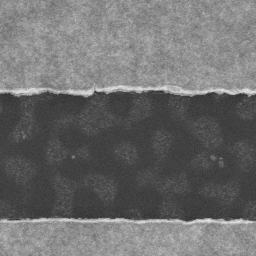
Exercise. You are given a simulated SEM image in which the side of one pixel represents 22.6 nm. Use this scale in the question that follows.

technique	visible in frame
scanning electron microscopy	one or a few lines or trenches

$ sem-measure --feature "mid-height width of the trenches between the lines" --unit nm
2960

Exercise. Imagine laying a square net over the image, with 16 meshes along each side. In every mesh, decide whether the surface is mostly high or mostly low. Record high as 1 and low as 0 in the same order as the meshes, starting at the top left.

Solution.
1111111111111111
1111111111111111
1111111111111111
1111111111111111
1111111111111111
1111111111111111
0000000000000000
0000000000000000
0000000000000000
0000000000000000
0000000000000000
0000000000000000
0000000000000000
0000000000000000
1111111111111111
1111111111111111